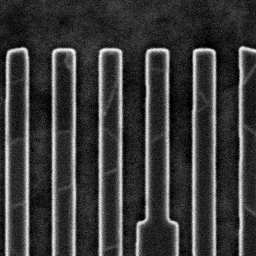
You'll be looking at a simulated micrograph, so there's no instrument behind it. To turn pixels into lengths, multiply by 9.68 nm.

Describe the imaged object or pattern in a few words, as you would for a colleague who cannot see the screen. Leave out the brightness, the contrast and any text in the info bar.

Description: wiring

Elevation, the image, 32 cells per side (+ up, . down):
................................
................................
................................
................................
................................
................................
.++....++....++....++...+++...++
.++....++...+++...+++...+++...++
.++....++...+++...+++...+++...++
.++....++....++...+++...+++...++
.++....++....++...+++...+++...++
.++....++...+++...+++...+++...++
.++....++...+++...+++...+++...++
.++....++....++...+++...+++...++
.++....++....++...+++...+++...++
.++....++....++...+++...+++...++
.++....++....++...+++...+++...++
.++....++...+++...+++...+++...++
.++....++...+++...+++...+++...++
.++....++...+++...+++...+++...++
.++....++...+++...+++...+++...++
.++....++...+++...+++...+++...++
.++....++....++...+++...+++...++
.++....++...+++...+++...+++...++
.++....++...+++...+++...+++...++
.++....++...+++...+++...+++...++
.++....++...+++...+++...+++...++
.++....++....++...+++...+++...++
.++....++....++..+++++..+++...++
.++....++....++..+++++..+++...++
.++....++....++..+++++..+++...++
.++....++....++..+++++..+++...++